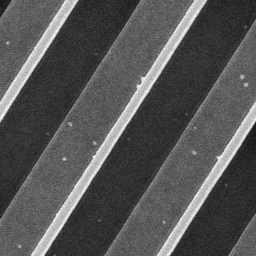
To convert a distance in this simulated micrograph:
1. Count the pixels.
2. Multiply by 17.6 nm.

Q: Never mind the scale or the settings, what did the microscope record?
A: lines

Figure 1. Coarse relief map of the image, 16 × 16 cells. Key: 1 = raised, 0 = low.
1111100001111000
1111000011110000
1110000111100001
1110000111100001
1100001111000011
1000011110000111
1000011110000111
0000111100001111
0001111000011110
0001111000011110
0011110000111100
0111110001111000
0111100001111000
1111000011110000
1111000011110001
1110000111100001